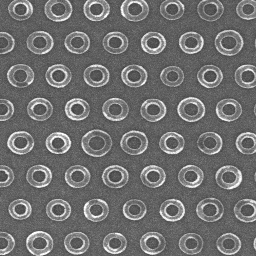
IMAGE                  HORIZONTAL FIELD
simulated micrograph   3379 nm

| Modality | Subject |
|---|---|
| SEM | a regular array of ring-shaped raised bodies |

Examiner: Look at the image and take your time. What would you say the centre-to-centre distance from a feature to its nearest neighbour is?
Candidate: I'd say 497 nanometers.